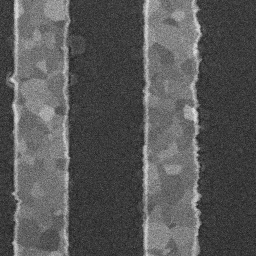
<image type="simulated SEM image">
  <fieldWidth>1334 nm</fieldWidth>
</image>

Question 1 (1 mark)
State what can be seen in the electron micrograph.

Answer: one or a few lines or trenches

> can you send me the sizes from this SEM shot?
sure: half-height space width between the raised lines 80.5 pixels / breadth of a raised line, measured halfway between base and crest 256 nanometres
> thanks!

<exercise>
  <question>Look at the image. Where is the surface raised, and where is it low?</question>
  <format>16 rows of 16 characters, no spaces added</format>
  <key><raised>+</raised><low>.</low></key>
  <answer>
.+++.....+++....
.+++.....+++....
.+++.....+++....
.+++.....+++....
.+++.....+++....
.+++.....+++....
.+++.....+++....
.+++.....+++....
.+++.....+++....
.+++.....+++....
.+++.....+++....
.+++.....+++....
.+++.....+++....
.+++.....+++....
.+++.....+++....
.+++.....+++....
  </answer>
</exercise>